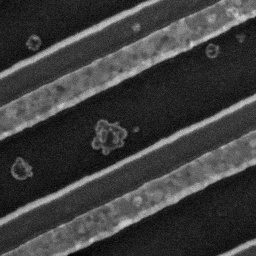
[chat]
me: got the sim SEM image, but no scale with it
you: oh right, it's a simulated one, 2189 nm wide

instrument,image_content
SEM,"lines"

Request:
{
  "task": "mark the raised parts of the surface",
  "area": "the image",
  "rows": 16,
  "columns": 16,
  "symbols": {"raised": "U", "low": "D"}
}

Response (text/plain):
DDDDDDDDDUUUUUUU
DDDDDDDUUUUUUUUD
DDDDDUUUUUUUUDDD
DDDUUUUUUUUDDDDD
DUUUUUUUUDDDDDDD
UUUUUUUDDDDDDDDD
UUUUUDDDDDDDDDDU
UUUDDDDDDDDDDUUU
UDDDDDDDDDDUUUUU
DDDDDDDDDUUUUUUU
DDDDDDDUUUUUUUUD
DDDDDUUUUUUUUDDD
DDDUUUUUUUUDDDDD
DUUUUUUUUDDDDDDD
UUUUUUUDDDDDDDDD
UUUUUDDDDDDDDDDU